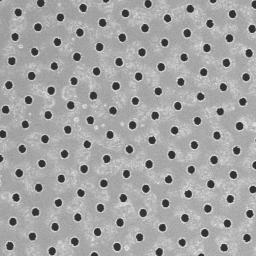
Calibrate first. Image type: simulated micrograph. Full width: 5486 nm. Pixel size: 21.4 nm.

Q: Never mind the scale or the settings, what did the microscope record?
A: a regular array of holes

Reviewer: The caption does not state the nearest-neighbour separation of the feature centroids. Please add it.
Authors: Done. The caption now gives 521 nm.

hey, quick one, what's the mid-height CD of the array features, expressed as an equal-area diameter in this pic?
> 0.168 micrometres